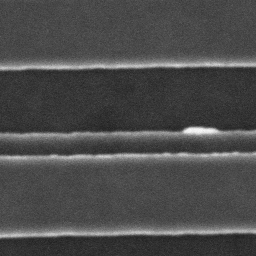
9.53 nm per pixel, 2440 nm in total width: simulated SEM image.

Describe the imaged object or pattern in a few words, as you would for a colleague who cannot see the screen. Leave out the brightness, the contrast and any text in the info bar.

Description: lines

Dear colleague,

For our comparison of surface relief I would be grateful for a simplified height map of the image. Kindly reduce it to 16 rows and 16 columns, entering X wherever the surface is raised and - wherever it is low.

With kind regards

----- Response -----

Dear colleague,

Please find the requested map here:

XXXXXXXXXXXXXXXX
XXXXXXXXXXXXXXXX
XXXXXXXXXXXXXXXX
XXXXXXXXXXXXXXXX
----------------
----------------
----------------
----------------
----------------
----------------
XXXXXXXXXXXXXXXX
XXXXXXXXXXXXXXXX
XXXXXXXXXXXXXXXX
XXXXXXXXXXXXXXXX
XXXXXXXXXXXXXXXX
----------------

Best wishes